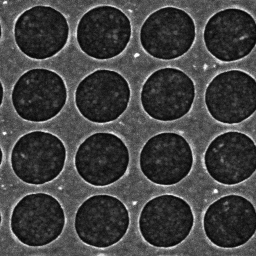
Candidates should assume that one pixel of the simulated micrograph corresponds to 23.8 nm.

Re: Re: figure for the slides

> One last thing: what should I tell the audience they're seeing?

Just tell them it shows a regular array of holes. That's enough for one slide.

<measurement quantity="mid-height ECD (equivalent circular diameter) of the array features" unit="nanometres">1290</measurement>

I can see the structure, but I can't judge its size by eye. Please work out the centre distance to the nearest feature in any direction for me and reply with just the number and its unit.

1.48 um